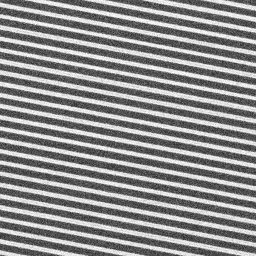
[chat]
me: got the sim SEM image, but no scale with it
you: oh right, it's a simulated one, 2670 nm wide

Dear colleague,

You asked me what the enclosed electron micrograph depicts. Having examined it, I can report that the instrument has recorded parallel lines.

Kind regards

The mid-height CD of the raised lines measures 35.8 nm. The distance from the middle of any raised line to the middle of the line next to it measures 116 nm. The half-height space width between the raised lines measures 82 nm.